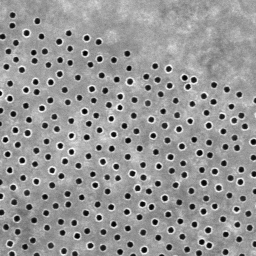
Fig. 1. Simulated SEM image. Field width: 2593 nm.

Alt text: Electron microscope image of a regular array of holes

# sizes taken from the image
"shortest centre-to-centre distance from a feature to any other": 12.8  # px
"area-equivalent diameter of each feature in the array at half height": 0.0637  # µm